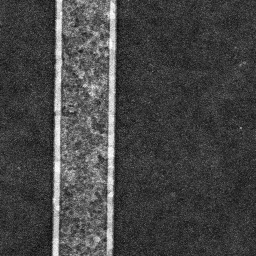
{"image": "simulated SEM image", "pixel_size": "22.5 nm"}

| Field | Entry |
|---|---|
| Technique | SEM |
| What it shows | one or a few lines or trenches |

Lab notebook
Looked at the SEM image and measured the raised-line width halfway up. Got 1200 nm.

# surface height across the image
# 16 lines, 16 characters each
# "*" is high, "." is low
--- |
....***.........
....***.........
....***.........
....***.........
....***.........
....***.........
....***.........
....***.........
....***.........
....***.........
....***.........
....***.........
....***.........
....***.........
....***.........
....***.........